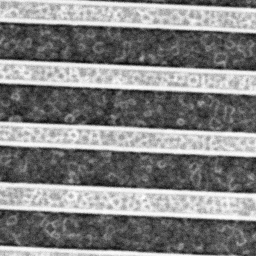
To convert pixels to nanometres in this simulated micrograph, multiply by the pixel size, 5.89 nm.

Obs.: one or a few lines or trenches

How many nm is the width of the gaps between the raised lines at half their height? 245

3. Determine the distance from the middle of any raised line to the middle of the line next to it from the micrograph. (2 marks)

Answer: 366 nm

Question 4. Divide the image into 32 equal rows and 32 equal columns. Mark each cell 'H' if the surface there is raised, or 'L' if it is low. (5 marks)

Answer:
HHHHHHHHHHHHHHLLLLLLLLLLLLLLLLLL
HHHHHHHHHHHHHHHHHHHHHHHHHHHHHHHH
LLHHHHHHHHHHHHHHHHHHHHHHHHHHHHHH
LLLLLLLLLLLLLLLLLLLLLLLLHHHHHHHH
LLLLLLLLLLLLLLLLLLLLLLLLLLLLLLLL
LLLLLLLLLLLLLLLLLLLLLLLLLLLLLLLL
LLLLLLLLLLLLLLLLLLLLLLLLLLLLLLLL
LLLLLLLLLLLLLLLLLLLLLLLLLLLLLLLL
HHHHHHHHHHHHHHHHHLLLLLLLLLLLLLLL
HHHHHHHHHHHHHHHHHHHHHHHHHHHHHHHH
LLLLLLLHHHHHHHHHHHHHHHHHHHHHHHHH
LLLLLLLLLLLLLLLLLLLLLLLLLLLLLHHH
LLLLLLLLLLLLLLLLLLLLLLLLLLLLLLLL
LLLLLLLLLLLLLLLLLLLLLLLLLLLLLLLL
LLLLLLLLLLLLLLLLLLLLLLLLLLLLLLLL
HLLLLLLLLLLLLLLLLLLLLLLLLLLLLLLL
HHHHHHHHHHHHHHHHHHHHHHLLLLLLLLLL
HHHHHHHHHHHHHHHHHHHHHHHHHHHHHHHH
LLLLLLLLLLLLLLHHHHHHHHHHHHHHHHHH
LLLLLLLLLLLLLLLLLLLLLLLLLLLLLLLL
LLLLLLLLLLLLLLLLLLLLLLLLLLLLLLLL
LLLLLLLLLLLLLLLLLLLLLLLLLLLLLLLL
LLLLLLLLLLLLLLLLLLLLLLLLLLLLLLLL
HHHHHHHHHHHLLLLLLLLLLLLLLLLLLLLL
HHHHHHHHHHHHHHHHHHHHHHHHHHHHHHHH
HHHHHHHHHHHHHHHHHHHHHHHHHHHHHHHH
LLLLLLLLLLLLLHHHHHHHHHHHHHHHHHHH
LLLLLLLLLLLLLLLLLLLLLLLLLLLLLLLL
LLLLLLLLLLLLLLLLLLLLLLLLLLLLLLLL
LLLLLLLLLLLLLLLLLLLLLLLLLLLLLLLL
LLLLLLLLLLLLLLLLLLLLLLLLLLLLLLLL
HHHHHHHHHHHLLLLLLLLLLLLLLLLLLLLL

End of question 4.